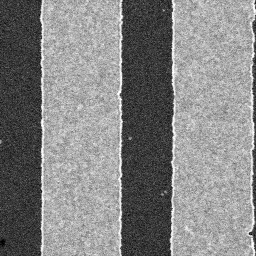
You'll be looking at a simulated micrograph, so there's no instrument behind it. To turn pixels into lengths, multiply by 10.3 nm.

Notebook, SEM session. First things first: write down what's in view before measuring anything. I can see one or a few lines or trenches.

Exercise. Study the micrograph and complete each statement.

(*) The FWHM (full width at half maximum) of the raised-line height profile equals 0.804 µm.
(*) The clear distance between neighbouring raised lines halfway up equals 542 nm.